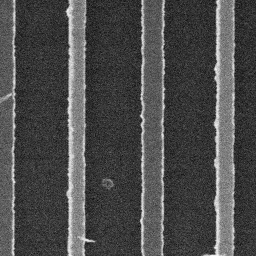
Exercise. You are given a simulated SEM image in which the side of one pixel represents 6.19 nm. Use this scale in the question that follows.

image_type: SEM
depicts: lines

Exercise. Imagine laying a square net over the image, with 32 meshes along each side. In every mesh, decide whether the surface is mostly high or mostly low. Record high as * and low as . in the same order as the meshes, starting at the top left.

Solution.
**.......**.......**.......**...
**.......**.......**.......**...
**.......**.......**.......**...
**.......**.......**.......**...
**.......**.......**.......**...
**.......**.......**.......**...
**.......**.......**.......**...
**.......**.......**.......**...
**.......**.......**.......**...
**.......**.......**.......**...
**.......**.......**.......**...
**.......**.......**.......**...
**.......**.......**.......**...
**.......**.......**.......**...
**.......**.......**.......**...
**.......**.......**.......**...
**.......**.......**.......**...
**.......**.......**.......**...
**.......**.......**.......**...
**.......**.......**.......**...
**.......**.......**.......**...
**.......**.......**.......**...
**.......**.......**.......**...
**.......**.......**.......**...
**.......**.......**.......**...
**.......**.......**.......**...
**.......**.......**.......**...
**.......**.......**.......**...
**.......**.......**.......**...
**.......**.......**.......**...
**.......**.......**.......**...
**.......**.......**.......**...